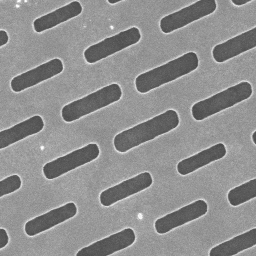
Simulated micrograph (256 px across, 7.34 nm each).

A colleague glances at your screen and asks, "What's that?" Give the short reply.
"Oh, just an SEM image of a regular array of holes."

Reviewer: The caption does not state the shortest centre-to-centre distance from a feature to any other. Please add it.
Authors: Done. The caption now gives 450 nm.